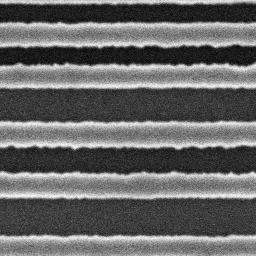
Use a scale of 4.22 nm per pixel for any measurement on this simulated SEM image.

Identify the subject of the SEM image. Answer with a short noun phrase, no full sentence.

lines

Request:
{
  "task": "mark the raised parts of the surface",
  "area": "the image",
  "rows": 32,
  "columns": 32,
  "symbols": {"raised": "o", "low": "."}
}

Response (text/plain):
.....o......o.o.o......o........
................................
................................
oooooooooooooooooooooooooooooooo
oooooooooooooooooooooooooooooooo
oooooooooooooooooooooooooooooooo
................................
................................
oooooooooooooooooooooooooooooooo
oooooooooooooooooooooooooooooooo
oooooooooooooooooooooooooooooooo
................................
................................
................................
................................
oooooooooooooooooooooooooooooooo
oooooooooooooooooooooooooooooooo
oooooooooooooooooooooooooooooooo
.........o............o.........
................................
................................
................................
oooooooooooooooooooooooooooooooo
oooooooooooooooooooooooooooooooo
oooooooooooooooooooooooooooooooo
................................
................................
................................
................................
.............................o..
oooooooooooooooooooooooooooooooo
oooooooooooooooooooooooooooooooo